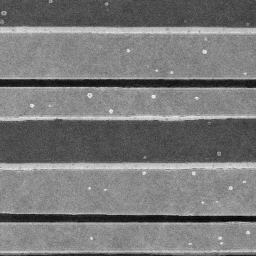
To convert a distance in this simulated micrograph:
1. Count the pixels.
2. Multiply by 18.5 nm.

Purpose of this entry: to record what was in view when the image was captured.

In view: lines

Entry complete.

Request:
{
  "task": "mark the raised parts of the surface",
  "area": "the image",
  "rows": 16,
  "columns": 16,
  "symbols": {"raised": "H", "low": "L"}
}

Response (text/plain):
LLLLLLLLLLLLLLLL
LLLLLLLLLLLLLLLL
HHHHHHHHHHHHHHHH
HHHHHHHHHHHHHHHH
HHHHHHHHHHHHHHHH
HHHHHHHHHHHHHHHH
HHHHHHHHHHHHHHHH
LLLLLLLLLLLLLLLL
LLLLLLLLLLLLLLLL
LLLLLLLLLLLLLLLL
LLLLLHHHHHHHHHHH
HHHHHHHHHHHHHHHH
HHHHHHHHHHHHHHHH
HHHHHHHHHHHHHHHH
HHHHHHHHHHHHHHHH
HHHHHHHHHHHHHHHH